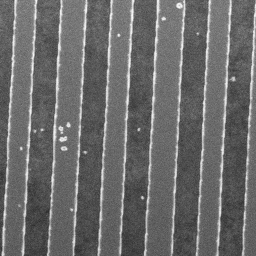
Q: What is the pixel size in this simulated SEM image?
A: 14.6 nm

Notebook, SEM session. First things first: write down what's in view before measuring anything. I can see lines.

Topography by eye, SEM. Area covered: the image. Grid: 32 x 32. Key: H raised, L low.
LLHHHLLLHHHLLLHHHLLLHHHLLLHHHLLL
LLHHLLLLHHHLLLHHHLLLHHHLLLHHHLLL
LLHHLLLLHHHLLLHHHLLLHHHLLLHHHLLL
LLHHLLLHHHHLLLHHLLLLHHHLLLHHHLLL
LLHHLLLHHHHLLLHHLLLHHHHLLLHHHLLL
LLHHLLLHHHHLLLHHLLLHHHHLLLHHHLLL
LLHHLLLHHHLLLLHHLLLHHHHLLLHHHLLL
LLHHLLLHHHLLLLHHLLLHHHHLLLHHLLLL
LLHHLLLHHHLLLHHHLLLHHHHLLLHHLLLH
LHHHLLLHHHLLLHHHLLLHHHHLLLHHLLLH
LHHHLLLHHHLLLHHHLLLHHHHLLLHHLLLH
LHHHLLLHHHLLLHHHLLLHHHLLLLHHLLLH
LHHHLLLHHHLLLHHHLLLHHHLLLHHHLLLH
LHHHLLLHHHLLLHHHLLLHHHLLLHHHLLLH
LHHHLLLHHHLLLHHHLLLHHHLLLHHHLLLH
LHHHLLLHHHLLLHHHLLLHHHLLLHHHLLLH
LHHHLLLHHHLLLHHHLLLHHHLLLHHHLLLH
LHHHLLLHHHLLLHHHLLLHHHLLLHHHLLLH
LHHHLLLHHHLLLHHHLLLHHHLLLHHHLLLH
LHHHLLLHHHLLLHHHLLLHHHLLLHHHLLLH
LHHHLLLHHHLLLHHHLLLHHHLLLHHHLLLH
LHHLLLLHHHLLLHHHLLLHHHLLLHHHLLLH
LHHLLLLHHHLLLHHHLLLHHHLLLHHHLLLH
LHHLLLLHHHLLLHHLLLLHHHLLLHHHLLLH
LHHLLLHHHHLLLHHLLLLHHHLLLHHHLLLH
LHHLLLHHHHLLLHHLLLHHHHLLLHHHLLLH
LHHLLLHHHHLLLHHLLLHHHHLLLHHHLLLH
LHHLLLHHHLLLLHHLLLHHHHLLLHHLLLLH
HHHLLLHHHLLLLHHLLLHHHHLLLHHLLLHH
HHHLLLHHHLLLHHHLLLHHHHLLLHHLLLHH
HHHLLLHHHLLLHHHLLLHHHHLLLHHLLLHH
HHHLLLHHHLLLHHHLLLHHHHLLLHHLLLHH